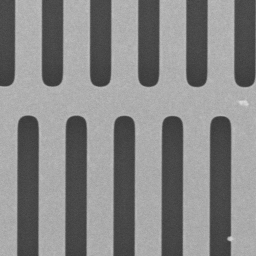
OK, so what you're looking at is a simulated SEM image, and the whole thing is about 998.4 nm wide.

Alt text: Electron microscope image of groups of lines, slits or small figures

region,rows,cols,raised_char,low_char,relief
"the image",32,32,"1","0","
00111000111000111000111000111000
00111000111000111000111000111000
00111000111000111000111000111000
00111000111000111000111000111000
00111000111000111000111000111000
00111000111000111000111000111000
00111000111000111000111000111000
00111000111000111000111000111000
00111000111000111000111000111000
00111000111000111000111000111000
01111101111101111101111100111100
11111111111111111111111111111111
11111111111111111111111111111111
11111111111111111111111111111111
11101111101111101111101111101111
11000111000111000111000111000111
11000111000111000111000111000111
11000111000111000111000111000111
11000111000111000111000111000111
11000111000111000111000111000111
11000111000111000111000111000111
11000111000111000111000111000111
11000111000111000111000111000111
11000111000111000111000111000111
11000111000111000111000111000111
11000111000111000111000111000111
11000111000111000111000111000111
11000111000111000111000111000111
11000111000111000111000111000111
11000111000111000111000111000111
11000111000111000111000111000111
11000111000111000111000111000111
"